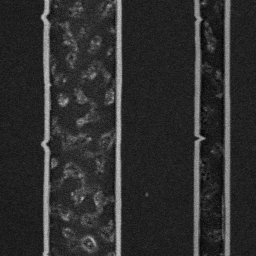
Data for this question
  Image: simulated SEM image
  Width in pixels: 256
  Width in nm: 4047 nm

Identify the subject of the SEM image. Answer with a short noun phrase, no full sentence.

one or a few lines or trenches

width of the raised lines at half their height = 1.23 micrometres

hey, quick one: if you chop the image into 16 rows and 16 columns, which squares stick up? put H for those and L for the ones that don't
HHHLLLLHHHHHLLHH
HHHLLLLHHHHHLLHH
HHHLLLLHHHHHLLHH
HHHLLLLHHHHHLLHH
HHHLLLLHHHHHLLHH
HHHLLLLHHHHHLLHH
HHHLLLLHHHHHLLHH
HHHLLLLHHHHHLLHH
HHHLLLLHHHHHLLHH
HHHLLLLHHHHHLLHH
HHHLLLLHHHHHLLHH
HHHLLLLHHHHHLLHH
HHHLLLLHHHHHLLHH
HHHLLLLHHHHHLLHH
HHHLLLLHHHHHLLHH
HHHLLLLHHHHHLLHH